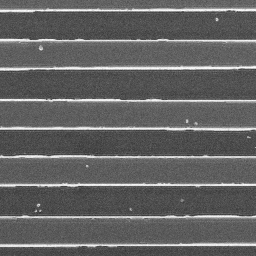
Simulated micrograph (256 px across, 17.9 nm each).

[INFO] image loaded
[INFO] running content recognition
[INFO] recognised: lines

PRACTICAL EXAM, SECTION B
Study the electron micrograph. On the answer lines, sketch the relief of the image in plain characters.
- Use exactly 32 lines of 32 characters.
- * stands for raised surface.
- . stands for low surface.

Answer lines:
********************************
................................
................................
................................
................................
********************************
********************************
********************************
***************.*...............
................................
................................
................................
******.**.**.**.................
********************************
********************************
********************************
................................
................................
................................
................................
********************************
********************************
********************************
................................
................................
................................
................................
********************************
********************************
********************************
********************************
................................